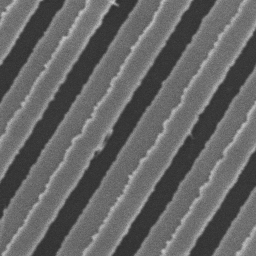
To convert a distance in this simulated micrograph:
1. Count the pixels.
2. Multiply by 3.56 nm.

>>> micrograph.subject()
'lines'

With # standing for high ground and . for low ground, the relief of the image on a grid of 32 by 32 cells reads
#####...######...#######...#####
####...######...#######...######
####...######...#######..#######
###...######...#######...#######
##...######...#######...#######.
##...######...#######...#######.
#...######...#######...#######..
....######...######...########..
...######...#######...#######...
..######...#######...#######...#
..######...######...########...#
.######...#######...#######...##
######...#######...#######...###
######...#######..########..####
#####...#######...#######...####
####....######...#######...#####
####...#######...#######...#####
###...#######...#######...######
###..########..#######....######
##...#######...#######...######.
#...#######...#######...#######.
#...#######..########...######..
...#######...#######...#######..
..#######...#######...#######...
..######....#######...######...#
.#######...#######...#######...#
#######...#######...#######...##
#######...#######...######...###
######...#######...#######...###
#####...########..#######...####
#####...#######...######....####
####...#######...#######...#####